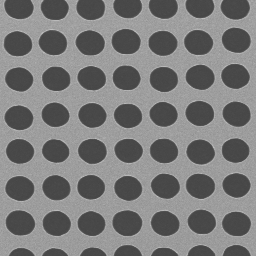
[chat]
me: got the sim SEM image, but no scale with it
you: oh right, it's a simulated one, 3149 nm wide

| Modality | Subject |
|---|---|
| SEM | a regular array of holes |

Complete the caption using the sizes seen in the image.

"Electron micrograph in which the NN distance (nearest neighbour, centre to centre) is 430 nm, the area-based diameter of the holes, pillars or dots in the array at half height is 0.319 µm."